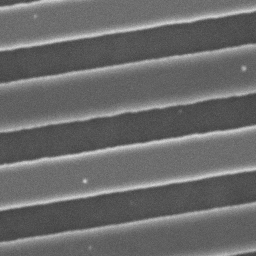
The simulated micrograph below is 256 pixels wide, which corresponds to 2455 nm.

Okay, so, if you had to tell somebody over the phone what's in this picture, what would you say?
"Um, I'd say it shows lines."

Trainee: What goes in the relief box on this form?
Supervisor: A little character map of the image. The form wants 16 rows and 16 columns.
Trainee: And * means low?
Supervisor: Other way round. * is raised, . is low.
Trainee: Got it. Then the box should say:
****************
**********......
****............
...........*****
.....***********
****************
************....
*****...........
............****
......**********
****************
**********......
****............
...........*****
....************
****************